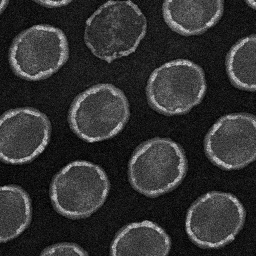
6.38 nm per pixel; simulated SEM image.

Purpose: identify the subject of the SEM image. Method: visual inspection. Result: raised bodies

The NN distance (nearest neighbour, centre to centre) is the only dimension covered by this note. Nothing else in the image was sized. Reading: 0.498 µm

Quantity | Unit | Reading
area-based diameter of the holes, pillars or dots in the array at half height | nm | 356